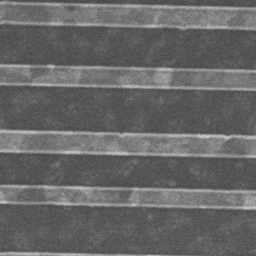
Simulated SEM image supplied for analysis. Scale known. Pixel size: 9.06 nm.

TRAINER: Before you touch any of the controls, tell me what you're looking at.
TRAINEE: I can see one or a few lines or trenches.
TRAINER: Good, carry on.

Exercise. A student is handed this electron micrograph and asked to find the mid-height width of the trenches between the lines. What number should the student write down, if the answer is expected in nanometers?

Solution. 387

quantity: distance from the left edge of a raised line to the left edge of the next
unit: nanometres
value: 548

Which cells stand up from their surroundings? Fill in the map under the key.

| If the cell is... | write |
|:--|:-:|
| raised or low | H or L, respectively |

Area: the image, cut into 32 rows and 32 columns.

HHHHHLLLLLLLLLLLLLLLLLLLLLLLLLLL
HHHHHHHHHHHHHHHHHHHHHHHHHHHHHHHH
HHHHHHHHHHHHHHHHHHHHHHHHHHHHHHHH
LLLLLLLLLLLLLLLLLLLLLLLLLLLLLLLH
LLLLLLLLLLLLLLLLLLLLLLLLLLLLLLLL
LLLLLLLLLLLLLLLLLLLLLLLLLLLLLLLL
LLLLLLLLLLLLLLLLLLLLLLLLLLLLLLLL
LLLLLLLLLLLLLLLLLLLLLLLLLLLLLLLL
HHHHHHHHHHHHHLLLHLLLLLLLLLLLLLLL
HHHHHHHHHHHHHHHHHHHHHHHHHHHHHHHH
LLLLLHHHHHHHHHHHHHHHHHHHHHHHHHHH
LLLLLLLLLLLLLLLLLLLLLLLLLLLLLLLL
LLLLLLLLLLLLLLLLLLLLLLLLLLLLLLLL
LLLLLLLLLLLLLLLLLLLLLLLLLLLLLLLL
LLLLLLLLLLLLLLLLLLLLLLLLLLLLLLLL
LLLLLLLLLLLLLLLLLLLLLLLLLLLLLLLL
HHHHHLLLLLLLLLLLLLLLLLLLLLLLLLLL
HHHHHHHHHHHHHHHHHHHHHHHHHHHHHHHH
HHHHHHHHHHHHHHHHHHHHHHHHHHHHHHHH
LLLLLLLLLLLLLLLLLLLLLLLLLLLHHHHL
LLLLLLLLLLLLLLLLLLLLLLLLLLLLLLLL
LLLLLLLLLLLLLLLLLLLLLLLLLLLLLLLL
LLLLLLLLLLLLLLLLLLLLLLLLLLLLLLLL
HHHHHHHHLLLLLLLLLLLLLLLLLLLLLLLL
HHHHHHHHHHHHHHHHHHHHHHHHHHHHHHHH
LLLLLLLLLLLHHHHHHHHHHHHHHHHHHHHH
LLLLLLLLLLLLLLLLLLLLLLLLLLLLLLLL
LLLLLLLLLLLLLLLLLLLLLLLLLLLLLLLL
LLLLLLLLLLLLLLLLLLLLLLLLLLLLLLLL
LLLLLLLLLLLLLLLLLLLLLLLLLLLLLLLL
LLLLLLLLLLLLLLLLLLLLLLLLLLLLLLLL
LLLLLLLLLLLLLLLLLLLLLLLLLLLLLLLL